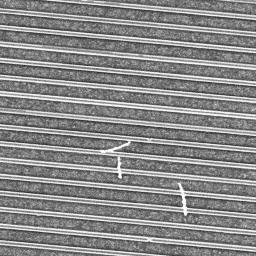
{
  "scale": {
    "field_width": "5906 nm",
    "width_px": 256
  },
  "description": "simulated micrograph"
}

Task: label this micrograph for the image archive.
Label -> parallel lines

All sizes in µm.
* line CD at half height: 0.0861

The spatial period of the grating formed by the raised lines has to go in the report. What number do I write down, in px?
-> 16.5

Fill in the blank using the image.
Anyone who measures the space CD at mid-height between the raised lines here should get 302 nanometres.